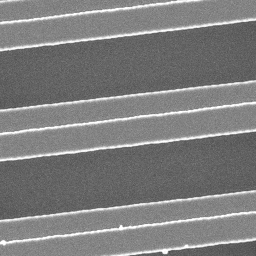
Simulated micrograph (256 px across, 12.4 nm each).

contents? lines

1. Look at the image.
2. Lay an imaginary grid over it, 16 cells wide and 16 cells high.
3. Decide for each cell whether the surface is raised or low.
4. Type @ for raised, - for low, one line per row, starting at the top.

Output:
@@@@@@@@@@@@@@@@
@@@@@@@@@@@@@@--
@@@@@@----------
----------------
----------------
------------@@@@
---@@@@@@@@@@@@@
@@@@@@@@@@@@@@@@
@@@@@@@@@@@@@---
@@@@@-----------
----------------
----------------
-----------@@@@@
---@@@@@@@@@@@@@
@@@@@@@@@@@@@@@@
@@@@@@@@@@@@----